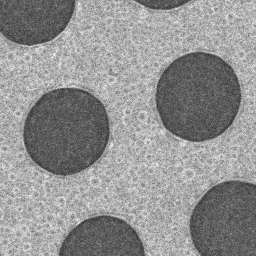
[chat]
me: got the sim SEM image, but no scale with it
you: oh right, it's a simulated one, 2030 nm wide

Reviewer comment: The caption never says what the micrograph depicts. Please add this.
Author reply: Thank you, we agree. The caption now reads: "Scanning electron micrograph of holes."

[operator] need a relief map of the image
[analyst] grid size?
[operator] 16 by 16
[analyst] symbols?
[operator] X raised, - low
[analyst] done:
-----XXXX--XXXXX
----XXXXXXXXXXXX
X--XXXXXXXXXXXXX
XXXXXXXXXXX---XX
XXXXXXXXXX-----X
XXXXXXXXXX-----X
XX----XXXX-----X
XX-----XXX-----X
X------XXXX---XX
XX----XXXXXXXXXX
XXX--XXXXXXXXXXX
XXXXXXXXXXXXXX--
XXXXXXXXXXXXX---
XXXXXX-XXXXX----
XXXX----XXXX----
XXXX-----XXX----